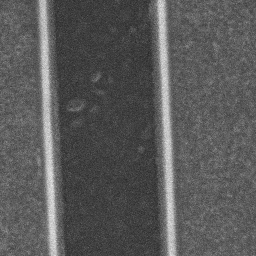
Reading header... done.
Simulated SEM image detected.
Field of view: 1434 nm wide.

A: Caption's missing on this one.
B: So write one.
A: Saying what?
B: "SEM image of one or a few lines or trenches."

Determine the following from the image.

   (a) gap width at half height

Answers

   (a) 663 nanometers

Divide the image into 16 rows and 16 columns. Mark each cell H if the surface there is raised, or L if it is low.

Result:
HHHLLLLLLLHHHHHH
HHHLLLLLLLHHHHHH
HHHLLLLLLLHHHHHH
HHHLLLLLLLHHHHHH
HHHLLLLLLLHHHHHH
HHHLLLLLLLHHHHHH
HHHLLLLLLLHHHHHH
HHHLLLLLLLHHHHHH
HHHLLLLLLLHHHHHH
HHHLLLLLLLLHHHHH
HHHLLLLLLLLHHHHH
HHHLLLLLLLLHHHHH
HHHLLLLLLLLHHHHH
HHHLLLLLLLLHHHHH
HHHLLLLLLLLHHHHH
HHHLLLLLLLLHHHHH